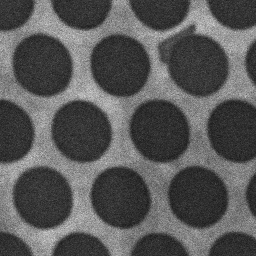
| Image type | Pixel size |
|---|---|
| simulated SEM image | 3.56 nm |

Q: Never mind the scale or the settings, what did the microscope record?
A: a regular array of holes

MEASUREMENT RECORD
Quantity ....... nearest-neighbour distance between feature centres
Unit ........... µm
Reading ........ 0.272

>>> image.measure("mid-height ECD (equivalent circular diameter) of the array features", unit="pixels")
61.2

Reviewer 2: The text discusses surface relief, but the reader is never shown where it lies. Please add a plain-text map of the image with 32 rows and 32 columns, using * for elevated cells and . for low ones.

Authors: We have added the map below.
....**........**........**......
....***.......***......***......
...*****.....****......****.....
..*******...*******...*.****...*
****..********..******....******
**......****......**.......****.
**.......***......**........***.
**.......**........*........***.
**.......**........**........**.
**.......***.......**.......***.
***......***......****......****
****....*****....******....*****
.******************.*********.**
...*****....*****.....*****.....
....***......****......***......
....***.......**.......***......
....**........**........**......
....***.......***.......**......
....***.......***......****.....
...*****.....*****.....*****....
********************************
***....******....*****.....*****
**......****......****......***.
**.......**.......***.......***.
**.......**........**.......***.
**.......***.......**........**.
**.......***.......***......***.
***.....*****.....*****....*****
*****.*********.*********.******
..******....******...*******...*
...****......****......****.....
....***.......**.......***......